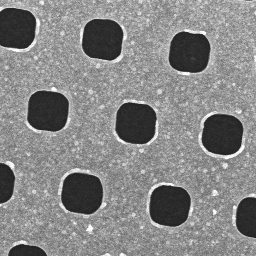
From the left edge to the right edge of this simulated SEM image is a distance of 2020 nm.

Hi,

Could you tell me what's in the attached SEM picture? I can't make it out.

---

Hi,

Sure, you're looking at holes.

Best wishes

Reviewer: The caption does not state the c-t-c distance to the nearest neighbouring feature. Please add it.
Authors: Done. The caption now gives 692 nanometers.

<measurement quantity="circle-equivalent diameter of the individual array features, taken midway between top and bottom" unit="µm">0.34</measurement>